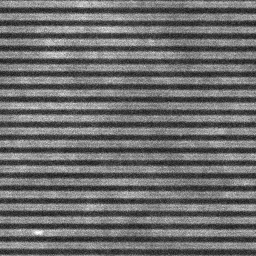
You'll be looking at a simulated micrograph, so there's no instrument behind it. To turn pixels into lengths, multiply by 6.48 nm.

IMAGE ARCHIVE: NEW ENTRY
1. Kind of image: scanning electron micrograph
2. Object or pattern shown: parallel lines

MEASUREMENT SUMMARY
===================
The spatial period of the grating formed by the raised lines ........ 82.3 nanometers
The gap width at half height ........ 46.2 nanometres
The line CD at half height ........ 34.9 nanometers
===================